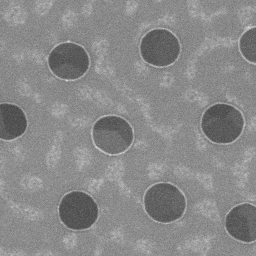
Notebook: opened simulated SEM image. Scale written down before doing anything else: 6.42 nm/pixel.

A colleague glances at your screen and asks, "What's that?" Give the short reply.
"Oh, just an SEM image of raised bodies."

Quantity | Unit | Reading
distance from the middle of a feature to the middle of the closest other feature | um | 0.55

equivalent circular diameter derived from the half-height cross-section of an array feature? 264 nm